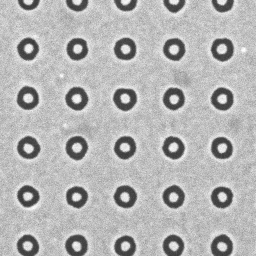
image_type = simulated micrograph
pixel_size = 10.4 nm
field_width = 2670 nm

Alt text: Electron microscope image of a regular array of ring-shaped grooves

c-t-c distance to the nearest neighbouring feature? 0.503 microns